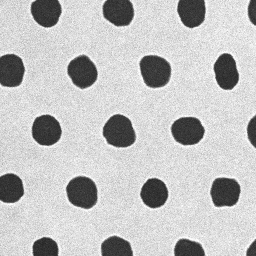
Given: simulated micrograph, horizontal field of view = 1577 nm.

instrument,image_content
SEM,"a regular array of holes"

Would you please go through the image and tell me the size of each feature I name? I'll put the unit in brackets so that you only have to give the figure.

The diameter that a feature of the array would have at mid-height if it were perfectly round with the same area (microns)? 0.187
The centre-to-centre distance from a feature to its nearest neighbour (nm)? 423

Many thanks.